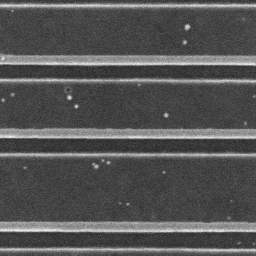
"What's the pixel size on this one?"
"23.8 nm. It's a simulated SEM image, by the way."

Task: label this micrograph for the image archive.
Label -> lines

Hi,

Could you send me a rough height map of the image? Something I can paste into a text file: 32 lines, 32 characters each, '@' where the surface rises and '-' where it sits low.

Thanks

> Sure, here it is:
--------------------------------
@@@@@@@@@@@@@@@@@@@@@@@@@@@@@@@@
@@@@@@@@@@@@@@@@@@@@@@@@@@@@@@@@
@@@@@@@@@@@@@@@@@@@@@@@@@@@@@@@@
@@@@@@@@@@@@@@@@@@@@@@@@@@@@@@@@
@@@@@@@@@@@@@@@@@@@@@@@@@@@@@@@@
@@@@@@@@@@@@@@@@@@@@@@@@@@@@@@@@
@@@@@@@@@@@@@@@@@@@@@@@@@@@@@@@@
--------------------------------
--------------------------------
@@@@@@@@@@@@@@@@@@@@@@@@@@@@@@@@
@@@@@@@@@@@@@@@@@@@@@@@@@@@@@@@@
@@@@@@@@@@@@@@@@@@@@@@@@@@@@@@@@
@@@@@@@@@@@@@@@@@@@@@@@@@@@@@@@@
@@@@@@@@@@@@@@@@@@@@@@@@@@@@@@@@
@@@@@@@@@@@@@@@@@@@@@@@@@@@@@@@@
@@@@@@@@@@@@@@@@@@@@@@@@@@@@@@@@
--------------------------------
--------------------------------
@@@@@@@@@@@@@@@@@@@@@@@@@@@@@@@@
@@@@@@@@@@@@@@@@@@@@@@@@@@@@@@@@
@@@@@@@@@@@@@@@@@@@@@@@@@@@@@@@@
@@@@@@@@@@@@@@@@@@@@@@@@@@@@@@@@
@@@@@@@@@@@@@@@@@@@@@@@@@@@@@@@@
@@@@@@@@@@@@@@@@@@@@@@@@@@@@@@@@
@@@@@@@@@@@@@@@@@@@@@@@@@@@@@@@@
@@@@@@@@@@@@@@@@@@@@@@@@@@@@@@@@
@@@@@@@@@@@@@@@@@@@@@@@@@@@@@@@@
@@@@@@@@@@@@@@@@@@@@@@@@@@@@@@@@
--------------------------------
--------------------------------
@@@@@@@@@@@@@@@@@@@@@@@@@@@@@@@@